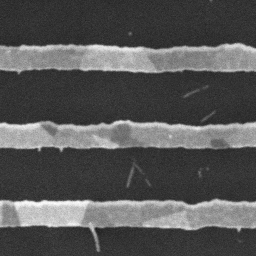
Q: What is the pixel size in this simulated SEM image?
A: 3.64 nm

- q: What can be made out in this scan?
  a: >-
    lines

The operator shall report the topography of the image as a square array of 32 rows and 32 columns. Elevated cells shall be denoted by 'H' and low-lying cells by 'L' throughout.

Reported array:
LLLLLLLLLLLLLLLLLLLLLLLLLLLLLLLL
LLLLLLLLLLLLLLLLLLLLLLLLLLLLLLLL
LLLLLLLLLLLLLLLLLLLLLLLLLLLLLLLL
LLLLLLLLLLLLLLLLLLLLLLLLLLLLLLLL
LLLLLLLLLLLLLLLLLLLLLLLLLLLLLLLL
LLLLLLLLLLLLLLLLLLLLLLLLLLLLLHLL
HHHHHHHHHHHHHHHHHHHHHHHHHHHHHHHH
HHHHHHHHHHHHHHHHHHHHHHHHHHHHHHHH
HHHHHHHHHHHHHHHHHHHHHHHHHHHHHHHH
LLLLLLLLLLLLLLLLLLLLLLLLLLLLLLLL
LLLLLLLLLLLLLLLLLLLLLLLLLLLLLLLL
LLLLLLLLLLLLLLLLLLLLLLLLLLLLLLLL
LLLLLLLLLLLLLLLLLLLLLLLLLLLLLLLL
LLLLLLLLLLLLLLLLLLLLLLLLLLLLLLLL
LLLLLLLLLLLLLLLLLLLLLLLLLLLLLLLL
LLLLHHHLLLLLLLHHHHHHHLLLLLLLLLLH
HHHHHHHHHHHHHHHHHHHHHHHHHHHHHHHH
HHHHHHHHHHHHHHHHHHHHHHHHHHHHHHHH
LLLLLLLLLLLLLLLLLLLLLLLLLLHHLLLL
LLLLLLLLLLLLLLLLLLLLLLLLLLLLLLLL
LLLLLLLLLLLLLLLLLLLLLLLLLLLLLLLL
LLLLLLLLLLLLLLLLLLLLLLLLLLLLLLLL
LLLLLLLLLLLLLLLLLLLLLLLLLLLLLLLL
LLLLLLLLLLLLLLLLLLLLLLLLLLLLLLLL
LLLLLLLLLLLLLLLLLLLLLLLLLLLLLLLL
HHHHHHHHHHHHHHHHHHHHHHHLLHHHHHHH
HHHHHHHHHHHHHHHHHHHHHHHHHHHHHHHH
HHHHHHHHHHHHHHHHHHHHHHHHHHHHHHHH
LLLLLLLLLLLHLLLLLLLLLLHHHLLLLLLH
LLLLLLLLLLLLLLLLLLLLLLLLLLLLLLLL
LLLLLLLLLLLLLLLLLLLLLLLLLLLLLLLL
LLLLLLLLLLLLLLLLLLLLLLLLLLLLLLLL